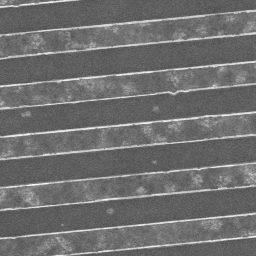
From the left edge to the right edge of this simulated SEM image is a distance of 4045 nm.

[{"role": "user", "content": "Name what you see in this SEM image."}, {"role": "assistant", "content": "parallel lines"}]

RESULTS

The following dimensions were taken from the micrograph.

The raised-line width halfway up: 0.37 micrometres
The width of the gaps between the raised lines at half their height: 429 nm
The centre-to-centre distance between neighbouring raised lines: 800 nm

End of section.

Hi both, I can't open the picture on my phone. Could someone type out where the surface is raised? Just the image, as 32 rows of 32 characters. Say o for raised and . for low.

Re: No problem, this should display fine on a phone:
oooo............................
.............................ooo
...................ooooooooooooo
.........ooooooooooooooooooooooo
ooooooooooooooooooooooooooooo...
oooooooooooooooooo..............
ooooooooo.......................
................................
........................oooooooo
.............ooooooooooooooooooo
...ooooooooooooooooooooooooooooo
ooooooooooooooooooooooo.........
oooooooooooo....................
oo..............................
..........................oooooo
.................ooooooooooooooo
.......ooooooooooooooooooooooooo
oooooooooooooooooooooooooo......
oooooooooooooooo................
ooooo...........................
...............................o
....................oooooooooooo
..........oooooooooooooooooooooo
oooooooooooooooooooooooooooooo..
ooooooooooooooooooo.............
ooooooooo.......................
................................
........................oooooooo
.............ooooooooooooooooooo
...ooooooooooooooooooooooooooooo
ooooooooooooooooooooooo.........
ooooooooooooo...................